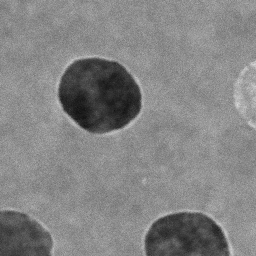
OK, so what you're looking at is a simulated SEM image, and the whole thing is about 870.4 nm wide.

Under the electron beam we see holes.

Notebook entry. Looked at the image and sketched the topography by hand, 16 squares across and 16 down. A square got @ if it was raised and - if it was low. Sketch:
@@@@@@@@@@@@@@@@
@@@@@@@@@@@@@@@@
@@@@@@@@@@@@@@@@
@@@@@@@@@@@@@@@@
@@@@----@@@@@@@@
@@@@-----@@@@@@@
@@@@-----@@@@@@@
@@@@----@@@@@@@@
@@@@@@@@@@@@@@@@
@@@@@@@@@@@@@@@@
@@@@@@@@@@@@@@@@
@@@@@@@@@@@@@@@@
@@@@@@@@@@@@@@@@
--@@@@@@@@---@@@
---@@@@@@-----@@
---@@@@@@-----@@